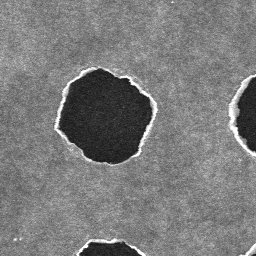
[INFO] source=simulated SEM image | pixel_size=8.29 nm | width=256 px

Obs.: holes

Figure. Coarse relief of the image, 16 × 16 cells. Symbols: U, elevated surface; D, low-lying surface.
UUUUUUUUUUUUUUUU
UUUUUUUUUUUUUUUU
UUUUUUUUUUUUUUUU
UUUUUUUUUUUUUUUU
UUUUUUDUUUUUUUUU
UUUUDDDDDUUUUUUD
UUUUDDDDDUUUUUUD
UUUUDDDDDUUUUUUD
UUUUDDDDDUUUUUUD
UUUUUDDDUUUUUUUU
UUUUUUUUUUUUUUUU
UUUUUUUUUUUUUUUU
UUUUUUUUUUUUUUUU
UUUUUUUUUUUUUUUU
UUUUUUUUUUUUUUUU
UUUUUDDDUUUUUUUU